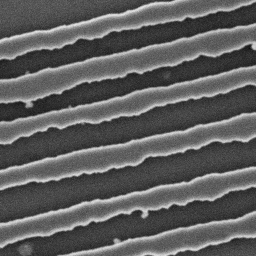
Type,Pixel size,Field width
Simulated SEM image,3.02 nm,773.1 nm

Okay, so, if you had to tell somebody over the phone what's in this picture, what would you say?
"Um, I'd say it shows lines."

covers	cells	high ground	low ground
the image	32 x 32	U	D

DDDDDDDDDDDDDDDDDDDUUUUUUUUUUUUD
DDDDDDDDDDDDDDDDUUUUUUUUUUUDDDDD
DDDDDDDDDDDUUUUUUUUUUUUDDDDDDDDD
DDDDDDDUUUUUUUUUUDDDDDDDDDDDDUUU
DDUUUUUUUUUUUDDDDDDDDDDDUUUUUUUU
UUUUUUUUDDDDDDDDDDDDUUUUUUUUUUUU
UUUUDDDDDDDDDDDDUUUUUUUUUUUUUDDD
DDDDDDDDDDDUUUUUUUUUUUUUDDDDDDDD
DDDDDDDUUUUUUUUUUUUDDDDDDDDDDDUU
DDDUUUUUUUUUUUUUDDDDDDDDDDDUUUUU
UUUUUUUUUUDDDDDDDDDDDDUUUUUUUUUU
UUUUUUUUDDDDDDDDDUUUUUUUUUUUDDDD
UUUUDDDDDDDDDDUUUUUUUUUDDDDDDDDD
DDDDDDDDDUUUUUUUUUUDDDDDDDDDDDDD
DDDDUUUUUUUUUUUDDDDDDDDDDDDDDDUU
UUUUUUUUUDDDDDDDDDDDDDDDDDUUUUUU
UUUUUDDDDDDDDDDDDDDDDDUUUUUUUUUU
UUDDDDDDDDDDDDDDDUUUUUUUUUUUUUUD
DDDDDDDDDDDDUUUUUUUUUUUUUDDDDDDD
DDDDDDDDUUUUUUUUUUUUDDDDDDDDDDDD
DDDUUUUUUUUUUUUUUDDDDDDDDDDDDDDD
UUUUUUUUUUUUDDDDDDDDDDDDDDDDUUUU
UUUUUUUDDDDDDDDDDDDDDDDDUUUUUUUU
UDDDDDDDDDDDDDDDDDDUUUUUUUUUUUUD
DDDDDDDDDDDDDDDUUUUUUUUUUUUUDDDD
DDDDDDDDDDUUUUUUUUUUUUUDDDDDDDDD
DDDDDDUUUUUUUUUUUDDDDDDDDDDDDDDD
DDUUUUUUUUUUUDDDDDDDDDDDDDDDUUUU
UUUUUUUUUDDDDDDDDDDDDDDUUUUUUUUU
UUUUUUDDDDDDDDDDDDDUUUUUUUUUUUUU
UDDDDDDDDDDDDDDUUUUUUUUUUUUDDDDD
DDDDDDDDDDUUUUUUUUUUUUDDDDDDDDDD